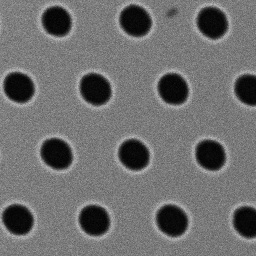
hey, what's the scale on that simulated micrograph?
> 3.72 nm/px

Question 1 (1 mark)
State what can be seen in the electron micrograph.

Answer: a regular array of holes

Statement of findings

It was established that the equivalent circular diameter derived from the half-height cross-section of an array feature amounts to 110 nm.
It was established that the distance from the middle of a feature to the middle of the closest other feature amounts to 283 nm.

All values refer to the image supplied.